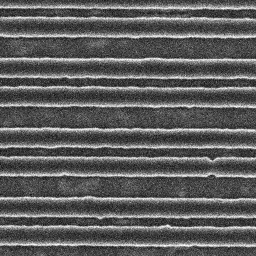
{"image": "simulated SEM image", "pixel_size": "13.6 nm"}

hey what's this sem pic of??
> parallel lines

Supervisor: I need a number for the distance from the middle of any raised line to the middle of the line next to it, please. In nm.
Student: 472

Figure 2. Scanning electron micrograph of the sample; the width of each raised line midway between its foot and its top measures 253 nm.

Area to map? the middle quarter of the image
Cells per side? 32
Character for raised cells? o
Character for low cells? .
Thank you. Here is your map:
oooooooooooooooooooooooooooooooo
oooooooooooooooooooooooooooooooo
oooooooooooooooooooooooooooooooo
.............o..........ooo...oo
................................
................................
oooooooooooooooooooooooooooooooo
oooooooooooooooooooooooooooooooo
oooooooooooooooooooooooooooooooo
oooooooooooooooooooooooooooooooo
.............ooooooooooooooooooo
................................
................................
................................
................................
................................
ooooooooo...ooooooooooooo..ooooo
oooooooooooooooooooooooooooooooo
oooooooooooooooooooooooooooooooo
oooooooooooooooooooooooooooooooo
oooooooooooooooooooooooooooooooo
................................
................................
ooooooooooooo......o......o...o.
oooooooooooooooooooooooooooooooo
oooooooooooooooooooooooooooooooo
oooooooooooooooooooooooooooooooo
oooooooooooooooooooooooooooooooo
................................
................................
................................
................................